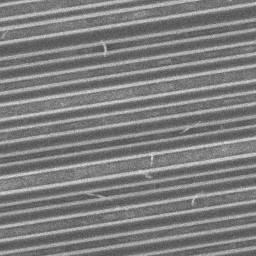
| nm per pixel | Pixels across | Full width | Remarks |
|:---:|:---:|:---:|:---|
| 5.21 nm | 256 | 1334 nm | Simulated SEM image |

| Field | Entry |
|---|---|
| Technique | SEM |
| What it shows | parallel lines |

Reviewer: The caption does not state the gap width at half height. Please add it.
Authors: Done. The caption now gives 0.0586 um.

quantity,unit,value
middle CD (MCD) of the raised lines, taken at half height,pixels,13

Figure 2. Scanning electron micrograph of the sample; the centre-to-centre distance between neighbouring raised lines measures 126 nm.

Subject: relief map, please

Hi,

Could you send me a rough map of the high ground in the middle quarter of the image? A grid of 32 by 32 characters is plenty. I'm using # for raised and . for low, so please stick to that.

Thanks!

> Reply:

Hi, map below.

##########.................#####
###..................###########
..............##################
........####################....
.#####################..........
###############.................
#########.......................
##........................######
....................############
.............##################.
.......#################........
##################..............
###########....................#
#####...................########
..................##############
...........#####################
.....######################.....
####################............
##############..............####
#######...............##########
#...............################
.........###################....
...####################.........
###############.................
#########.......................
##...........................###
.......................#########
................################
..........###################...
...###################..........
################..............##
#########...............########